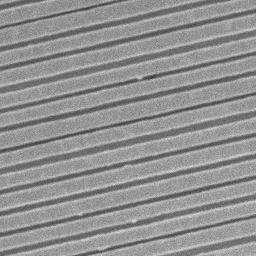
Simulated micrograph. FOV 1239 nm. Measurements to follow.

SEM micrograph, parallel lines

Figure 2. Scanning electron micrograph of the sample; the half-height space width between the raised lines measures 5.62 pixels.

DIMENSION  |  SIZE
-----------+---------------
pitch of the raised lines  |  0.0969 µm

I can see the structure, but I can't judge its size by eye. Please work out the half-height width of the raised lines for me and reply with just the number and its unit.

67.9 nanometres